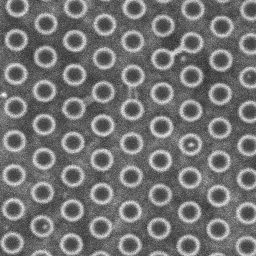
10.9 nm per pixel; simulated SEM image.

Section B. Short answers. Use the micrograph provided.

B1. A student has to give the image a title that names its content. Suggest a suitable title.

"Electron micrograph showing a regular array of raised bodies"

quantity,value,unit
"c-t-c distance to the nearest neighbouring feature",364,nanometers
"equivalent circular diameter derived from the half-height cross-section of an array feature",224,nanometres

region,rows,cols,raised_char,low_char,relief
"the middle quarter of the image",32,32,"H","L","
LHHHLLLLLHHHLLLLLLLLLLLHHHLLLLLL
HHHHHLLLLLLLLLLHHHHLLLLLLLLLLLHH
HHHHHLLLLLLLLLLHHHHHLLLLLLLLLHHH
HHHHHLLLLLLLLLLHHHHHLLLLLLLLLHHH
LHHHLLLLLLLLLLLHHHHLLLLLLLLLLLHH
LLLLLLLLHHHHLLLLLLLLLLLHHHLLLLLH
LLLLLLLHHHHHLLLLLLLLLLHHHHHLLLLL
LLLLLLLHHHHHLLLLLLLLLLHHHHHLLLLL
LLLLLLLLHHHHLLLLLLLLLLHHHHHLLLLL
HHHHLLLLLLLLLLLHHHHLLLLHHHLLLLHH
HHHHHLLLLLLLLLLHHHHLLLLLLLLLLLHH
HHHHHLLLLLLLLLHHHHHHLLLLLLLLLHHH
HHHHHLLLLLLLLLLHHHHLLLLLLLLLLHHH
LLHLLLLLHHHLLLLLHHLLLLLHHLLLLLHH
LLLLLLLHHHHHLLLLLLLLLLHHHHHLLLLL
LLLLLLLHHHHHLLLLLLLLLLHHHHHLLLLL
LLLLLLLHHHHHLLLLLLLLLLHHHHHLLLLL
LHHLLLLLHHHLLLLLHHLLLLLHHHLLLLLL
HHHHHLLLLLLLLLLHHHHLLLLLLLLLLLHH
HHHHHLLLLLLLLLHHHHHLLLLLLLLLLHHH
HHHHHLLLLLLLLLHHHHHHLLLLLLLLLHHH
LHHHLLLLLLLLLLLHHHHLLLLLLLLLLHHH
LLLLLLLHHHHHLLLLLLLLLLHHHHLLLLLH
LLLLLLLHHHHHLLLLLLLLLLHHHHHLLLLL
LLLLLLLHHHHHLLLLLLLLLLHHHHHLLLLL
LLLLLLLHHHHHLLLLLLLLLLHHHHLLLLLL
HHHHLLLLLLLLLLLHHHHLLLLHHLLLLLHH
HHHHHLLLLLLLLLHHHHHLLLLLLLLLLHHH
HHHHHLLLLLLLLLHHHHHLLLLLLLLLLHHH
HHHHLLLLLLLLLLLHHHHLLLLLLLLLLHHH
LLLLLLLLHHHLLLLLHHLLLLLHHLLLLLHH
LLLLLLLHHHHHLLLLLLLLLLHHHHLLLLLL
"